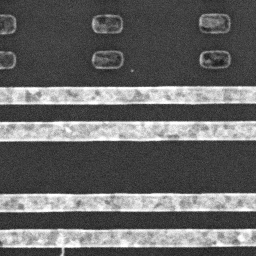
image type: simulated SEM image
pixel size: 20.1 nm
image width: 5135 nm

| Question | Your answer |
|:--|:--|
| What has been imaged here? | wiring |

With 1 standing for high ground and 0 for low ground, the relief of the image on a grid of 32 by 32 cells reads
00000000000000000000000000000000
00000000000000000000000000000000
11000000000011100000000001111000
11000000000011100000000001111000
00000000000000000000000000000000
00000000000000000000000000000000
00000000000001100000000000110000
11000000000011100000000001111000
00000000000000000000000000000000
00000000000000000000000000000000
00000000000000000000000000000000
11111111111111111111111111111111
11111111111111111111111111111111
00000000000000000000000000000000
00000000000000000000000000000000
11111111111111111111111111111111
11111111111111111111111111111111
11111111111100000110000000000000
00000000000000000000000000000000
00000000000000000000000000000000
00000000000000000000000000000000
00000000000000000000000000000000
00000000000000000000000000000000
00000000000000000000000000000000
11111111111111111111111111111111
11111111111111111111111111111111
00000000000000000000000000000000
00000000000000000000000000000000
00000000000000000000000000000000
11111111111111111111111111111111
11111111111111111111111111111111
00000000000000000000000000000000